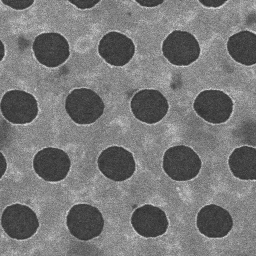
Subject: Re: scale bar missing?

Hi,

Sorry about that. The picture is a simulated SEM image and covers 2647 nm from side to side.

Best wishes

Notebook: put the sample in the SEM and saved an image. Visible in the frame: a regular array of holes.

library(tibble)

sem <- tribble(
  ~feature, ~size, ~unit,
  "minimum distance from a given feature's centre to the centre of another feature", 669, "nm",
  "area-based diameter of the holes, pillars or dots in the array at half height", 375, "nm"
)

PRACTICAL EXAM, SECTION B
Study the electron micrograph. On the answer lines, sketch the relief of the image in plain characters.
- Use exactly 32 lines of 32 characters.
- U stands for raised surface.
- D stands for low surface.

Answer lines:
UDDDUUUUUDDDUUUUUDDDUUUUUDDDUUUU
UUUUUUUUUUUUUUUUUUUUUUUUUUUUUUUU
UUUUUUUUUUUUUUUUUUUUUUUUUUUUUUUU
UUUUUUUUUUUUUUUUUUUUUUUUUUUUUUUU
UUUUUDDDUUUUUDDDUUUUUDDDUUUUUDDD
UUUUDDDDDUUUDDDDDUUUDDDDDUUUDDDD
DUUUDDDDDUUUDDDDDUUUDDDDDUUUUDDD
UUUUUDDDUUUUUDDDUUUUUDDDUUUUUDDD
UUUUUUUUUUUUUUUUUUUUUUUUUUUUUUUU
UUUUUUUUUUUUUUUUUUUUUUUUUUUUUUUU
UUUUUUUUUUUUUUUUUUUUUUUUUUUUUUUU
UDDUUUUUUDDDUUUUUDDDUUUUUDDDUUUU
DDDDDUUUDDDDDUUUDDDDDUUUDDDDDUUU
DDDDDUUUDDDDDUUUDDDDDUUUDDDDDUUU
UDDDDUUUUDDDDUUUUDDDDUUUUDDDDUUU
UUDUUUUUUUDUUUUUUUUUUUUUUUUUUUUU
UUUUUUUUUUUUUUUUUUUUUUUUUUUUUUUU
UUUUUUUUUUUUUUUUUUUUUUUUUUUUUUUU
UUUUUUDUUUUUUDDUUUUUUDDDUUUUUUDD
UUUUDDDDDUUUDDDDDUUUDDDDDUUUUDDD
DUUUDDDDDUUUDDDDDUUUDDDDDUUUUDDD
DUUUDDDDDUUUUDDDDUUUUDDDDUUUUDDD
UUUUUUDDUUUUUUDUUUUUUUDDUUUUUUDD
UUUUUUUUUUUUUUUUUUUUUUUUUUUUUUUU
UUUUUUUUUUUUUUUUUUUUUUUUUUUUUUUU
UUUUUUUUUUUUUUUUUUUUUUUUUUUUUUUU
DDDDUUUUUDDDDUUUUDDDUUUUUDDDUUUU
DDDDDUUUDDDDDUUUDDDDDUUUUDDDDUUU
DDDDDUUUDDDDDUUUUDDDDUUUUDDDDUUU
UDDDUUUUUDDDUUUUUUDDUUUUUUDDUUUU
UUUUUUUUUUUUUUUUUUUUUUUUUUUUUUUU
UUUUUUUUUUUUUUUUUUUUUUUUUUUUUUUU